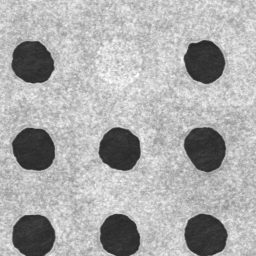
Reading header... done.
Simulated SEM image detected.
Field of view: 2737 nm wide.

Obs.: holes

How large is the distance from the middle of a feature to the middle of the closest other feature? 920 nm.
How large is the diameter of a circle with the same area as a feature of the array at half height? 454 nm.